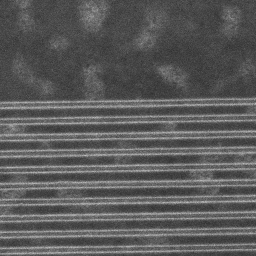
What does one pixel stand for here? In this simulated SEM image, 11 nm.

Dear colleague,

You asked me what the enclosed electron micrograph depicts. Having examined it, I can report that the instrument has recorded parallel lines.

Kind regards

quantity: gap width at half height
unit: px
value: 5.25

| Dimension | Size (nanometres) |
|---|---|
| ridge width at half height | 124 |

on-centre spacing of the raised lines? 178 nm